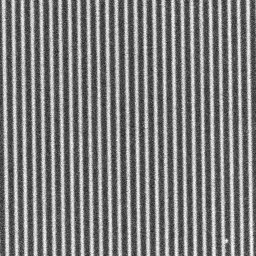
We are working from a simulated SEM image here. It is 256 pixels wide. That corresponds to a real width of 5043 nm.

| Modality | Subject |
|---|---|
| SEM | parallel lines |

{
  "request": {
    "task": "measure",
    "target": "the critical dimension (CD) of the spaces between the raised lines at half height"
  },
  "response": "0.138 microns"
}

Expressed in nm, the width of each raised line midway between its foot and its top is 41.9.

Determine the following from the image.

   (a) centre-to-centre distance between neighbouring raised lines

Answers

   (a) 185 nanometres